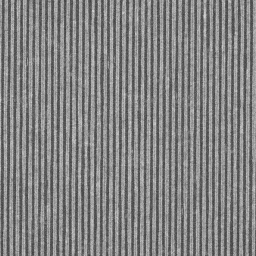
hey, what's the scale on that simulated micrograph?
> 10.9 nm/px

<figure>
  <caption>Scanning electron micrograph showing parallel lines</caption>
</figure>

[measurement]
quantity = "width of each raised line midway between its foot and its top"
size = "23.1 nanometres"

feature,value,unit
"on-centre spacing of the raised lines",67.5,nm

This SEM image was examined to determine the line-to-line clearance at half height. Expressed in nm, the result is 44.8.